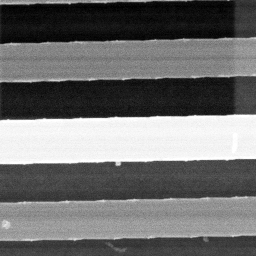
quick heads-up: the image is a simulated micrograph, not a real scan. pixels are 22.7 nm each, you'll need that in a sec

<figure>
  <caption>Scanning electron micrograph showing lines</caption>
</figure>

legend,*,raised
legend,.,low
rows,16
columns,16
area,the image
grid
................
................
...........*****
****************
****************
................
................
..**************
****************
****************
................
................
..........******
****************
****************
................